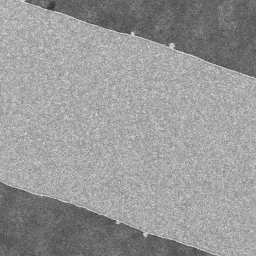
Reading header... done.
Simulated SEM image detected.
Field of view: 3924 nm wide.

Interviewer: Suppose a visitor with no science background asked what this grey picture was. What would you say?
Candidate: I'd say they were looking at one or a few lines or trenches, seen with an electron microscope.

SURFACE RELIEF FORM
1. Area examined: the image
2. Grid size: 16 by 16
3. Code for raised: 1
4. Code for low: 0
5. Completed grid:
1110000000000000
1111110000000000
1111111110000000
1111111111110000
1111111111111110
1111111111111111
1111111111111111
1111111111111111
1111111111111111
1111111111111111
1111111111111111
1111111111111111
0000111111111111
0000000111111111
0000000001111111
0000000000001111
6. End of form